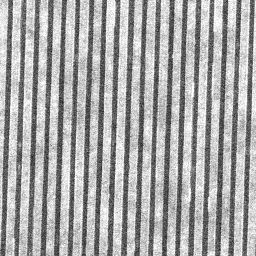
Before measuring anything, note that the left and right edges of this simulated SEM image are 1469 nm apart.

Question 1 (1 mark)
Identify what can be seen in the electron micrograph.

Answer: parallel lines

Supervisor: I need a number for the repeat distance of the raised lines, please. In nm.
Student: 77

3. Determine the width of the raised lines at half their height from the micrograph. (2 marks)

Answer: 7.49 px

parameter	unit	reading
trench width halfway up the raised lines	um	0.0323